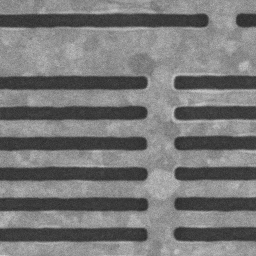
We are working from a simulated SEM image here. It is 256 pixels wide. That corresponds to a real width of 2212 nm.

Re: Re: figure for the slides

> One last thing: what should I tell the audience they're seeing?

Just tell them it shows groups of lines, slits or small figures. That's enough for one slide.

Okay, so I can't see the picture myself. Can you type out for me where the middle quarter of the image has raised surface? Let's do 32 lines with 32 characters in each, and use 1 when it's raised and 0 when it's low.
11111111111111111111111111111111
11111111111111111111111111111111
11111111111111111111111111111111
00000000000000000000011111100000
00000000000000000000011111100000
00000000000000000000011111100000
00000000000000000000111111110000
11111111111111111111111111111111
11111111111111111111111111111111
11111111111111111111111111111111
00000000000000000000111111110000
00000000000000000000011111100000
00000000000000000000011111100000
00000000000000000000111111100000
11111111111111111111111111111000
11111111111111111111111111111111
11111111111111111111111111111111
11111111111111111111111111111111
00000000000000000000111111110000
00000000000000000000011111100000
00000000000000000000011111100000
00000000000000000000111111110000
11111111111111111111111111111111
11111111111111111111111111111111
11111111111111111111111111111111
00000000001111111111111111111011
00000000000000000000011111100000
00000000000000000000011111100000
00000000000000000000011111110000
11111111111111111111111111111111
11111111111111111111111111111111
11111111111111111111111111111111